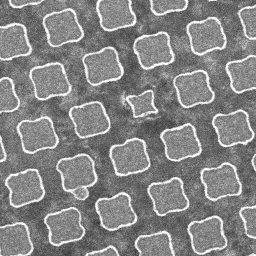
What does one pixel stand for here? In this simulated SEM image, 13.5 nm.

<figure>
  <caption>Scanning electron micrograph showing a regular array of raised bodies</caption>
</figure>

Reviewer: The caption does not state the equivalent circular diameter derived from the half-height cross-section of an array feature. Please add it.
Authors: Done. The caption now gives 491 nanometers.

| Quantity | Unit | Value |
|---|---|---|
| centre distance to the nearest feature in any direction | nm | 731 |